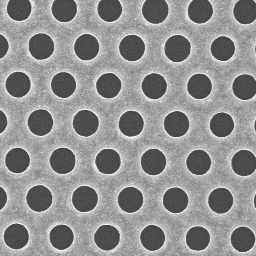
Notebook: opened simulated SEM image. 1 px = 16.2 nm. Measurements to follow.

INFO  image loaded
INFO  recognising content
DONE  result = a regular array of holes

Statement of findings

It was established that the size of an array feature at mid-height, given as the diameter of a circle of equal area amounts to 422 nm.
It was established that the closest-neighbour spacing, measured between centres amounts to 44 px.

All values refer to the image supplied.